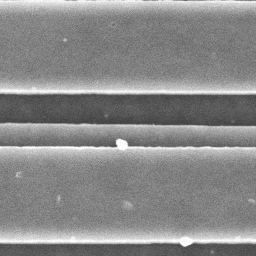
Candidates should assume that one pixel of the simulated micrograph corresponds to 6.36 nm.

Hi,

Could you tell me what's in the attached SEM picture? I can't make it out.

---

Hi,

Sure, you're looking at lines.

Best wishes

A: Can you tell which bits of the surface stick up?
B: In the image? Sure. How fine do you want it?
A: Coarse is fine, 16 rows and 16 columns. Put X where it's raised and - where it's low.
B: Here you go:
XXXXXXXXXXXXXXXX
XXXXXXXXXXXXXXXX
XXXXXXXXXXXXXXXX
XXXXXXXXXXXXXXXX
XXXXXXXXXXXXXXXX
XXXXXXXXXXXXXXXX
----------------
----------------
XXXXXX-XXXXXXXXX
XXXXXXXXXXXXXXXX
XXXXXXXXXXXXXXXX
XXXXXXXXXXXXXXXX
XXXXXXXXXXXXXXXX
XXXXXXXXXXXXXXXX
XXXXXXXXXXXXXXXX
----------------